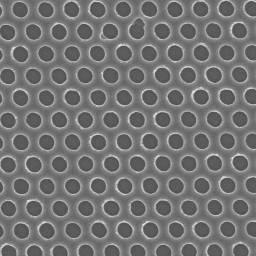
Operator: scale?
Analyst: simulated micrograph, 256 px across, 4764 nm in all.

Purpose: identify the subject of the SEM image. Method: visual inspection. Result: a regular array of holes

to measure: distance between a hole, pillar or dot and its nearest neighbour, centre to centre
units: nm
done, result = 470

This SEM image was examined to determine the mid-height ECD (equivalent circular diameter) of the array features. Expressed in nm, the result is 294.